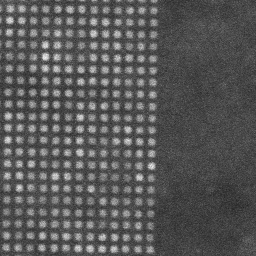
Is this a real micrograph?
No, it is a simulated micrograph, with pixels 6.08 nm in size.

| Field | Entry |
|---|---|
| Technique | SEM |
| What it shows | a regular array of raised bodies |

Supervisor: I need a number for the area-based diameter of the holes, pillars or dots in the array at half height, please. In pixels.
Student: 6.68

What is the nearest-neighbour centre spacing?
70.6 nm